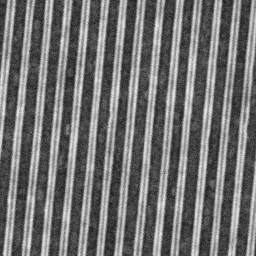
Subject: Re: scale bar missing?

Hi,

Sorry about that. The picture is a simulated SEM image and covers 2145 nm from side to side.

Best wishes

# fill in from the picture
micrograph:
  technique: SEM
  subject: parallel lines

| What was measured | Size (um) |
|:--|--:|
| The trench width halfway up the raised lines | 0.112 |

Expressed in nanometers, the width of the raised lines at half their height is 49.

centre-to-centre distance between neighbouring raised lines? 156 nm